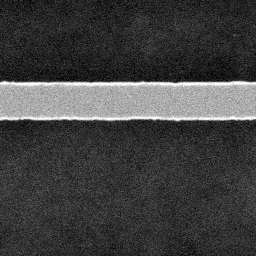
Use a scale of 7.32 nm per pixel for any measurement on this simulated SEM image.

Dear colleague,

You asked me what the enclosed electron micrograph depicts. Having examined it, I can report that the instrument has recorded lines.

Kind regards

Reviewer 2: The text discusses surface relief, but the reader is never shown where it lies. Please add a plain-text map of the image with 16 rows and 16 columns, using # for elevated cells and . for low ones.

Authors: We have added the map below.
................
................
................
................
................
################
################
................
................
................
................
................
................
................
................
................